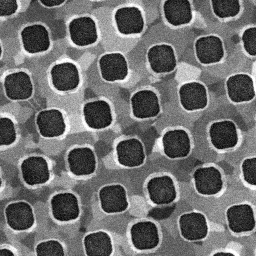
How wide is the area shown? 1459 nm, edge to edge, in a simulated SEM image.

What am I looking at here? a regular array of holes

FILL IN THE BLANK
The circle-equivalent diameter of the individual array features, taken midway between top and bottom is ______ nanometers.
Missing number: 173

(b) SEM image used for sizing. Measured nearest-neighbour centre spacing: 271 nanometers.